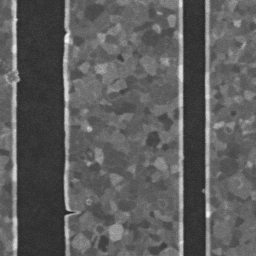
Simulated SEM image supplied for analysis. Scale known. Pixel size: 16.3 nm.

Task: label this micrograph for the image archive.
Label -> one or a few lines or trenches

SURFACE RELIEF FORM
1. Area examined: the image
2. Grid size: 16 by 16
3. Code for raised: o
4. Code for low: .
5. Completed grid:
o...ooooooo..ooo
o...ooooooo..ooo
o...ooooooo..ooo
o...ooooooo..ooo
o...ooooooo..ooo
o...ooooooo..ooo
o...ooooooo..ooo
o...ooooooo..ooo
o...ooooooo..ooo
o...ooooooo..ooo
o...ooooooo..ooo
o...ooooooo..ooo
o...ooooooo..ooo
o...ooooooo..ooo
o...ooooooo..ooo
o...ooooooo..ooo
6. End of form